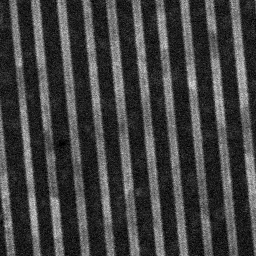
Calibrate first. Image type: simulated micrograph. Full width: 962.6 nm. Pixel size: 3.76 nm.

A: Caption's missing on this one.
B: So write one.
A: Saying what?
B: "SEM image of parallel lines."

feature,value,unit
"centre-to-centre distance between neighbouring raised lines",0.0923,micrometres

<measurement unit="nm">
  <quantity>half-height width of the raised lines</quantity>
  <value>26.7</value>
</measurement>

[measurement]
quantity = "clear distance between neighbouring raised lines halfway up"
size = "66.9 nm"